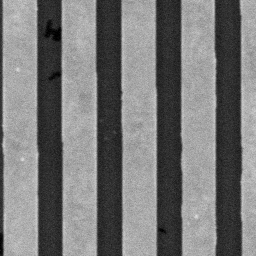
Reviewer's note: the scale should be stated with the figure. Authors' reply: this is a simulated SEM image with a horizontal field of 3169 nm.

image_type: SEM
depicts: lines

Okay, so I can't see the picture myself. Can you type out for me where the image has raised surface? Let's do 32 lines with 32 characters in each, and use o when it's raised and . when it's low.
ooooo...oooo...oooo....oooo...oo
ooooo...oooo...oooo....oooo...oo
ooooo...oooo...oooo....oooo...oo
ooooo...oooo...oooo....oooo...oo
ooooo...oooo...oooo....oooo...oo
ooooo...oooo...oooo....oooo...oo
ooooo...oooo...oooo....oooo...oo
ooooo...oooo...oooo....oooo...oo
ooooo...oooo...oooo....oooo...oo
ooooo...oooo...oooo....oooo...oo
ooooo...oooo...oooo....oooo...oo
ooooo...oooo...oooo....oooo...oo
ooooo...oooo...oooo....oooo...oo
ooooo...oooo...oooo....oooo...oo
ooooo...oooo...oooo....oooo...oo
ooooo...oooo...oooo....oooo...oo
ooooo...oooo...oooo....oooo...oo
ooooo...oooo...oooo....oooo...oo
ooooo...oooo...oooo....oooo...oo
.oooo...oooo...oooo....oooo...oo
.oooo...oooo...oooo....oooo...oo
.oooo...oooo...oooo....oooo...oo
.oooo...oooo...oooo....oooo...oo
.oooo...oooo...oooo....oooo...oo
.oooo...oooo...oooo....oooo...oo
.oooo...oooo...oooo....oooo...oo
.oooo...oooo...oooo....oooo...oo
.oooo...oooo...oooo....oooo...oo
.oooo...oooo...oooo....oooo...oo
.oooo...oooo...oooo....oooo...oo
.oooo...oooo...oooo....oooo...oo
.oooo...oooo...oooo....oooo...oo